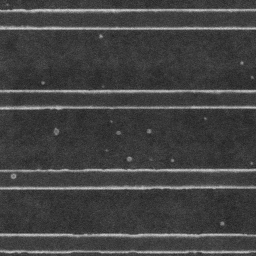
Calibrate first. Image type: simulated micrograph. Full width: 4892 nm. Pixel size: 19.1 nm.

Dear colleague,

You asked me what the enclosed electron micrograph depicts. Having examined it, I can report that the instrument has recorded lines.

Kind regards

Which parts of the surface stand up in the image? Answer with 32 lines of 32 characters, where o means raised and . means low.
................................
oooooooooooooooooooooooooooooooo
oooooooooooooooooooooooooooooooo
oooooooooooooooooooooooooooooooo
................................
................................
................................
................................
................................
................................
................................
oooooooooooooooooooooooooooooooo
oooooooooooooooooooooooooooooooo
oooo............................
................................
................................
................................
................................
................................
................................
................................
oooooooooooooooooooooooooooooooo
oooooooooooooooooooooooooooooooo
oooooooooooooooo.oo.............
................................
................................
................................
................................
................................
oooooooooooooooooooooooooooooooo
oooooooooooooooooooooooooooooooo
.o..ooooo...o.oo.ooooooo.oooooo.